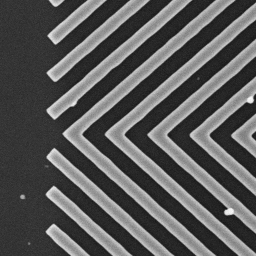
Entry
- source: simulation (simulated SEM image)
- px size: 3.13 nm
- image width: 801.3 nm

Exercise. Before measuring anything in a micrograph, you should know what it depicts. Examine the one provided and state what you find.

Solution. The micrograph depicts groups of lines, slits or small figures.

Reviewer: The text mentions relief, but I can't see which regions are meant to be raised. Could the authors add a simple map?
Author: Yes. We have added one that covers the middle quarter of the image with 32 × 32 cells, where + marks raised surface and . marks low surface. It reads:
++......+++++......+++++......++
+......+++++......+++++.....++++
......+++++......+++++.....+++++
.....+++++.....+++++......+++++.
....+++++.....+++++......+++++..
..+++++......+++++......+++++...
.+++++......+++++......+++++....
+++++......+++++......++++......
++++......+++++.....+++++......+
+++......+++++.....+++++......++
++.....+++++......+++++......+++
......+++++......+++++......++++
.....+++++......+++++.....+++++.
....+++++......+++++.....+++++..
...++++......+++++......+++++...
..+++++.....+++++......+++++....
+++++......+++++......+++++.....
+++++.....+++++......+++++......
.++++......+++++.....+++++......
..++++......+++++.....+++++.....
...++++......+++++......++++....
....+++++.....+++++......+++++..
.....+++++.....+++++......+++++.
......+++++.....+++++......+++++
+......+++++......++++......++++
++......+++++......+++++.....+++
++++.....+++++......+++++.....++
+++++.....+++++......+++++.....+
.+++++.....+++++......+++++.....
..+++++......+++++.....+++++....
...+++++......+++++.....+++++...
.....++++......+++++.....+++++..